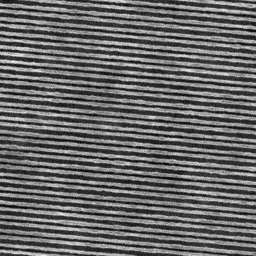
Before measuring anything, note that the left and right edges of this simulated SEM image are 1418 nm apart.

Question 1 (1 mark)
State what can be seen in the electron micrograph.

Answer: parallel lines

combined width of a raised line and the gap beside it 38.9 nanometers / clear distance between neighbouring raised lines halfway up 0.0241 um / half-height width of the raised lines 14.5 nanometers